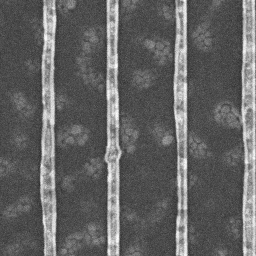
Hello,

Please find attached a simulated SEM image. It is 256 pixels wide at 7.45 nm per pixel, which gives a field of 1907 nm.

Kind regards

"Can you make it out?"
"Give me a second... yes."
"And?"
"one or a few lines or trenches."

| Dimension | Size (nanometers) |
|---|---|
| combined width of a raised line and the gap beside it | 498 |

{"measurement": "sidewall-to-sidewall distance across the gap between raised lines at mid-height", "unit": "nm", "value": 438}